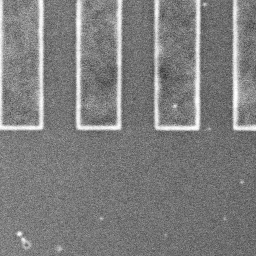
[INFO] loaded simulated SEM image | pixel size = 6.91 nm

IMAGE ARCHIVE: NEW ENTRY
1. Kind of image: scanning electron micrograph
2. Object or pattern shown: wiring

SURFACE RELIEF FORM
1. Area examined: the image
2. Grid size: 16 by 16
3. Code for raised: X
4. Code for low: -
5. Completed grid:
XXX--XX---XX---X
XXX--XX---XX---X
XXX--XX---XX---X
XXX--XX---XX---X
XXX--XX---XX---X
XXX--XX---XX---X
XXX--XX---XX---X
XXX--XX---XX---X
----------------
----------------
----------------
----------------
----------------
----------------
----------------
----------------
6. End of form